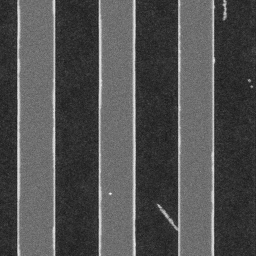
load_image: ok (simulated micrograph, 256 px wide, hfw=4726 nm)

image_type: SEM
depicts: lines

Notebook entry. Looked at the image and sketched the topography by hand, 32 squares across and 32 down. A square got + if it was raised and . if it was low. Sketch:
..+++++.....+++++.....+++++.....
..+++++.....+++++.....+++++.....
..+++++.....+++++.....+++++.....
..+++++.....+++++.....+++++.....
..+++++......++++.....+++++.....
..+++++......++++.....+++++.....
..+++++......++++.....+++++.....
..+++++......++++.....+++++.....
..+++++......++++.....+++++.....
..+++++......++++.....+++++.....
..+++++......++++.....+++++.....
..+++++.....+++++.....+++++.....
..+++++.....+++++.....+++++.....
..+++++.....+++++.....+++++.....
..+++++.....+++++.....+++++.....
..+++++.....+++++.....+++++.....
..+++++.....+++++.....+++++.....
..+++++.....+++++.....+++++.....
..+++++.....+++++.....+++++.....
..+++++.....+++++.....+++++.....
..+++++.....+++++.....+++++.....
..+++++.....+++++.....+++++.....
..+++++.....+++++.....+++++.....
..+++++.....+++++.....+++++.....
..+++++.....+++++.....+++++.....
..+++++.....+++++.....+++++.....
..+++++.....+++++.....+++++.....
..+++++.....+++++.....+++++.....
..+++++.....+++++.....+++++.....
..+++++.....+++++.....+++++.....
..+++++.....+++++.....+++++.....
..+++++.....+++++.....+++++.....